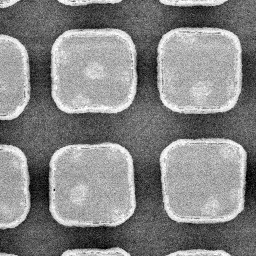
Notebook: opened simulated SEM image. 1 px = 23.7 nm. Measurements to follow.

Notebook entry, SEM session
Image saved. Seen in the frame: raised bodies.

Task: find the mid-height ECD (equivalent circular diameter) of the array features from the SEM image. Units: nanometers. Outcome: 2070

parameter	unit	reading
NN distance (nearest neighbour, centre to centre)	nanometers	2560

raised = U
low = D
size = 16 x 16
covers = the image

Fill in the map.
DDDDDDDDDDDDDDDD
DDDDDDDDDDDDDDDD
UDDDUUUUDDUUUUUD
UUDUUUUUDDUUUUUD
UUDUUUUUDDUUUUUD
UUDUUUUUDDUUUUUD
UDDDUUUUDDUUUUDD
DDDDDDDDDDDDDDDD
DDDDDDDDDDDDDDDD
UDDDUUUUDDUUUUUD
UUDUUUUUDDUUUUUD
UUDUUUUUDDUUUUUD
UUDUUUUUDDUUUUUD
UDDDUUUUDDDUUUUD
DDDDDDDDDDDDDDDD
DDDDDDDDDDDDDDDD